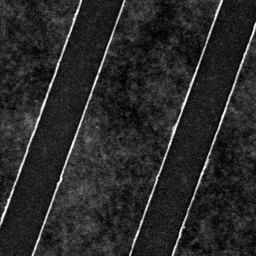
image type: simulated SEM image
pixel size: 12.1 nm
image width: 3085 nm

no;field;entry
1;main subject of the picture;one or a few lines or trenches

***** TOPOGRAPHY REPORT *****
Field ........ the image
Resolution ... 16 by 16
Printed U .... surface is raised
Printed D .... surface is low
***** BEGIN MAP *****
UUUUUDDDUUUUUUDD
UUUUUDDUUUUUUDDD
UUUUDDDUUUUUUDDD
UUUUDDDUUUUUUDDU
UUUDDDUUUUUUDDDU
UUUDDDUUUUUUDDDU
UUUDDUUUUUUUDDUU
UUDDDUUUUUUDDDUU
UUDDDUUUUUUDDUUU
UUDDUUUUUUDDDUUU
UDDDUUUUUUDDDUUU
UDDDUUUUUUDDUUUU
UDDUUUUUUDDDUUUU
DDDUUUUUUDDDUUUU
DDDUUUUUUDDUUUUU
DDUUUUUUDDDUUUUU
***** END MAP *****